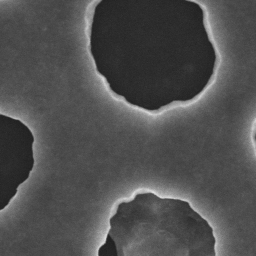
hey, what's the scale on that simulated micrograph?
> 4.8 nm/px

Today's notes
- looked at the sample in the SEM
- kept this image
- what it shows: holes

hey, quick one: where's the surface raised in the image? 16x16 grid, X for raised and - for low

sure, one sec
XXXXXX-------XXX
XXXXXX-------XXX
XXXXXX-------XXX
XXXXXX--------XX
XXXXXX-------XXX
XXXXXXX------XXX
XXXXXXXX---XXXXX
-XXXXXXXXXXXXXXX
--XXXXXXXXXXXXXX
--XXXXXXXXXXXXXX
--XXXXXXXXXXXXXX
-XXXXXXXXXXXXXXX
-XXXXXXX---XXXXX
XXXXXXX------XXX
XXXXXXX------XXX
XXXXXX-------XXX